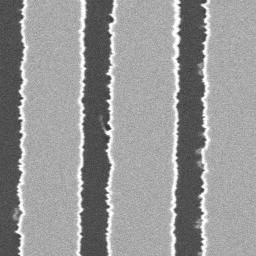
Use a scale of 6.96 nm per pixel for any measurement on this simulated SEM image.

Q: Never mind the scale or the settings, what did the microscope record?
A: lines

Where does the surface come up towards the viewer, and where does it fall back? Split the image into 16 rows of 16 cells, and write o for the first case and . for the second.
.oooo..oooo..ooo
.oooo..oooo..ooo
.oooo..oooo..ooo
.oooo..oooo..ooo
.oooo..oooo..ooo
.oooo..oooo..ooo
.oooo..oooo..ooo
.oooo..oooo..ooo
.oooo..oooo..ooo
.oooo..oooo..ooo
.oooo..oooo..ooo
.oooo..oooo..ooo
.oooo..oooo..ooo
.oooo..oooo..ooo
.oooo..oooo..ooo
.oooo..oooo..ooo